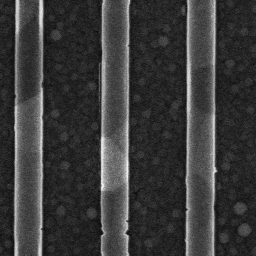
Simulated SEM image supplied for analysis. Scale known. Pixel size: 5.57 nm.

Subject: one or a few lines or trenches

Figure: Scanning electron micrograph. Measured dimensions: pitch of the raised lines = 480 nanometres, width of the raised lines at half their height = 0.149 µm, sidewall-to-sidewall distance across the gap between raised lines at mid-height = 330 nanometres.